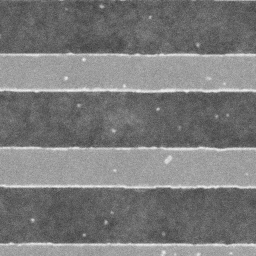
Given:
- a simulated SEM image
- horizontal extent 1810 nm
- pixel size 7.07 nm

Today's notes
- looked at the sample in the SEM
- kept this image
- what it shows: lines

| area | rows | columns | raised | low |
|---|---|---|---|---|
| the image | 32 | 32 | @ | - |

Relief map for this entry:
--------------------------------
--------------------------------
--------------------------------
--------------------------------
--------------------------------
--------------------------------
--------------------------------
@@@@@@@@@@@@@@@@@@@@@@@@@@@@@@@@
@@@@@@@@@@@@@@@@@@@@@@@@@@@@@@@@
@@@@@@@@@@@@@@@@@@@@@@@@@@@@@@@@
@@@@@@@@@@@@@@@@@@@@@@@@@@@@@@@@
--------------------------------
--------------------------------
--------------------------------
--------------------------------
--------------------------------
--------------------------------
--------------------------------
@@@@@---@@--------@@----@@------
@@@@@@@@@@@@@@@@@@@@@@@@@@@@@@@@
@@@@@@@@@@@@@@@@@@@@@@@@@@@@@@@@
@@@@@@@@@@@@@@@@@@@@@@@@@@@@@@@@
@@@@@@@@@@@@@@@@@@@@@@@@@@@@@@@@
--------------------------------
--------------------------------
--------------------------------
--------------------------------
--------------------------------
--------------------------------
--------------------------------
-@-@@@@------@------------------
@@@@@@@@@@@@@@@@@@@@@@@@@@@@@@@@